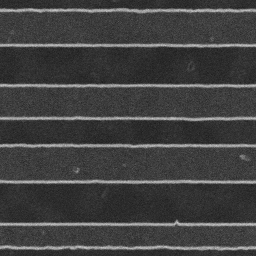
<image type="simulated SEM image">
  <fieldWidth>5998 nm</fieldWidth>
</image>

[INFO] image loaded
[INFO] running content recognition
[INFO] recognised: one or a few lines or trenches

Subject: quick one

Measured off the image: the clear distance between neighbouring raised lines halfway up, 937 nm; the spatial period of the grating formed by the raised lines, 1630 nm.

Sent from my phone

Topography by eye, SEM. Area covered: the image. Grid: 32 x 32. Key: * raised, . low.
................................
********************************
********************************
********************************
********************************
********************************
................................
................................
................................
................................
................................
********************************
********************************
********************************
********************************
................................
................................
................................
********************************
********************************
********************************
********************************
********************************
................................
................................
................................
................................
................................
********************************
********************************
********************************
................................